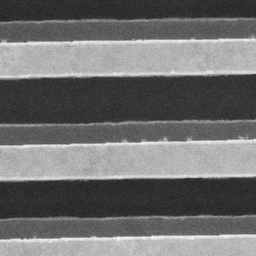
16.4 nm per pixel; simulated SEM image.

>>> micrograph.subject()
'lines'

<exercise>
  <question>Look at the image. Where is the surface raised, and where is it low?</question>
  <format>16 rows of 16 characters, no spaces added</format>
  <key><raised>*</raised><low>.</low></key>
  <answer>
................
****************
****************
****************
****************
................
................
................
****************
****************
****************
................
................
................
****************
****************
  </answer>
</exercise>